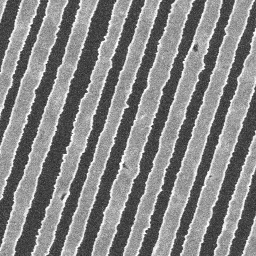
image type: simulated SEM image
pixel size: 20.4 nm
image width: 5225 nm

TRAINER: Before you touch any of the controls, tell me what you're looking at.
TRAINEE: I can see parallel lines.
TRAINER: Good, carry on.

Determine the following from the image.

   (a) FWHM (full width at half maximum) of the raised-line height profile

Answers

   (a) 310 nanometers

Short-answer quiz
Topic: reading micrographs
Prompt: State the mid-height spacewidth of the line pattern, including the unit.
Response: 0.276 microns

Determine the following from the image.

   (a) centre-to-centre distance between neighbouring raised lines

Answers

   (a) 596 nanometers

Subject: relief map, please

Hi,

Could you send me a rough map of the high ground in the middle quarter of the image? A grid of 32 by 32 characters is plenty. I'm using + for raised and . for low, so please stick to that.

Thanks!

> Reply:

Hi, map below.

+++.....++++...++++...+++++...++
+++....++++....+++....+++++...++
++.....++++...++++...+++++....++
++.....+++....++++...+++++...+++
+......+++....++++...++++....+++
+.....++++...++++....++++....+++
+.....+++....++++...++++....++++
+.....+++....+++....++++....++++
.....++++...++++...+++++....++++
....+++++...++++...+++++...++++.
....++++....++++...++++....++++.
....++++...++++....++++....++++.
...++++....++++...+++++...++++..
...++++....+++....++++....++++..
...++++....+++....++++....++++..
...++++...+++....+++++...++++...
..+++++...+++....+++++...++++...
..++++...++++....++++....+++....
..++++...+++....+++++...++++....
..++++...+++....+++++...++++...+
.++++...++++....++++....++++...+
.++++...++++...++.++....+++....+
++++....+++....+.++....++++...++
++++....+++....++++....++++...++
++++...++++...+.+++...++++....++
+++....+++......+++...++++...+++
+++...++++....+..++...+++....+++
+++...++++....++++...++++...++++
++....+++....+++++...++++...++++
++...++++....++++....++++...++++
+....++++...+++++....+++....++++
+....+++....+++++...++++...+++++